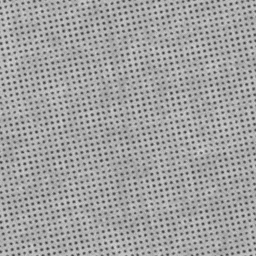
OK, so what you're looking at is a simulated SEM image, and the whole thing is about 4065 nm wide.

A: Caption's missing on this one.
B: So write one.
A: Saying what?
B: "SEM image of a regular array of holes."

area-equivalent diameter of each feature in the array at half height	0.0474	µm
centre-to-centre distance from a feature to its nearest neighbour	0.0886	um